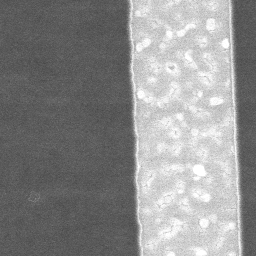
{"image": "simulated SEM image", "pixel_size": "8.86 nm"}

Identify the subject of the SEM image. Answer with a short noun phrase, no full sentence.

one or a few lines or trenches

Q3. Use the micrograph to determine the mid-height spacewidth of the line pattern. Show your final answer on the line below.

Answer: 867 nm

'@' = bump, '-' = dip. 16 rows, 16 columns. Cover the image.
@@@@@@@@------@@
@@@@@@@@------@@
@@@@@@@@------@@
@@@@@@@@------@@
@@@@@@@@------@@
@@@@@@@@@------@
@@@@@@@@@------@
@@@@@@@@-------@
@@@@@@@@@------@
@@@@@@@@@------@
@@@@@@@@@------@
@@@@@@@@@------@
@@@@@@@@@------@
@@@@@@@@@------@
@@@@@@@@@------@
@@@@@@@@@------@